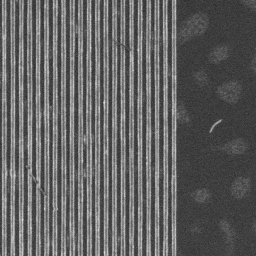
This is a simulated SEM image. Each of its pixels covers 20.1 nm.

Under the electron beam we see parallel lines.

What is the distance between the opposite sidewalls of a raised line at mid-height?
75.5 nm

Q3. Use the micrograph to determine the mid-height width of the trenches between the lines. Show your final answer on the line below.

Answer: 0.0956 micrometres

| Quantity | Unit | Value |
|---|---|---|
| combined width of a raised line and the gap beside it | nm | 171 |